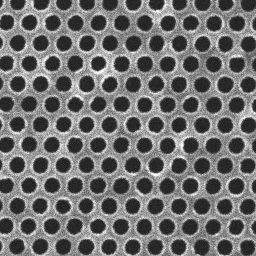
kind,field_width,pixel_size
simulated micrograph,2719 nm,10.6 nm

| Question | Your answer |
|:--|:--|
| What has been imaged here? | a regular array of holes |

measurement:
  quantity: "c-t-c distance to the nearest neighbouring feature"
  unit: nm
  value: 242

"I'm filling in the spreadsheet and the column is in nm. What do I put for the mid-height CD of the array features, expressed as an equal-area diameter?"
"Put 172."